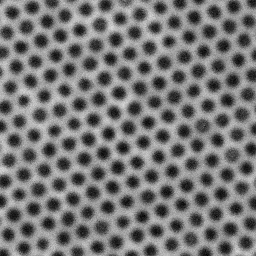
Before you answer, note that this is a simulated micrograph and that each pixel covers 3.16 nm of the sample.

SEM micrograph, a regular array of ring-shaped grooves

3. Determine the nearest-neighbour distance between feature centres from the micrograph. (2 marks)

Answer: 62.7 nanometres